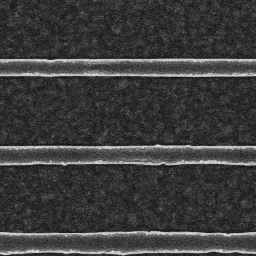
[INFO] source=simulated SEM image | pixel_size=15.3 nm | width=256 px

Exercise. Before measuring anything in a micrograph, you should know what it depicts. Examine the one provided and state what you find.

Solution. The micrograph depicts one or a few lines or trenches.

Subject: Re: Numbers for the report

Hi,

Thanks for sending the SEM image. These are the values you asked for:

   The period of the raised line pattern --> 87.6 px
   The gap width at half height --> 1070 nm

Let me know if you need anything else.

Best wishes